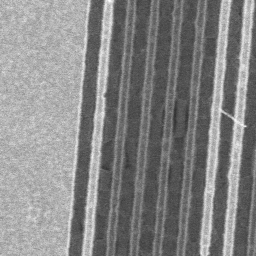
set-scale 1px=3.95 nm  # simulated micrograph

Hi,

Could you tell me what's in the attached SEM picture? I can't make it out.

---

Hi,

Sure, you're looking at parallel lines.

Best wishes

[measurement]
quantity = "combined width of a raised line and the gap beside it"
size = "92.1 nm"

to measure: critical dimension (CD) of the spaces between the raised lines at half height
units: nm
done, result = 61.4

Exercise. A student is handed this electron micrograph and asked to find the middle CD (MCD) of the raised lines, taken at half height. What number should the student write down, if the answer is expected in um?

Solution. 0.0324